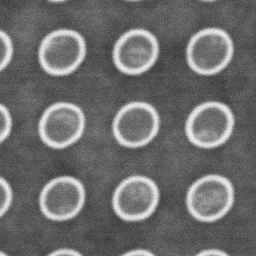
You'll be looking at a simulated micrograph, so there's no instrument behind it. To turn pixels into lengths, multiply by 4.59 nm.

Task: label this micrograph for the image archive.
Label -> a regular array of raised bodies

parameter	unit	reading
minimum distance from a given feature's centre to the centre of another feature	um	0.336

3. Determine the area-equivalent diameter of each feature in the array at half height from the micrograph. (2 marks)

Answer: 41.5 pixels